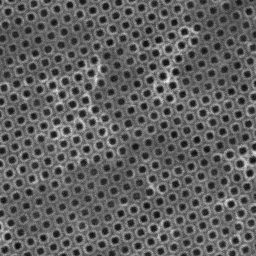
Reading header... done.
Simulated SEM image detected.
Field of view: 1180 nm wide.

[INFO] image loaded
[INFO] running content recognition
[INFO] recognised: a regular array of holes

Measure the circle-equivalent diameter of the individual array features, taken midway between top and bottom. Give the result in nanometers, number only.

37.5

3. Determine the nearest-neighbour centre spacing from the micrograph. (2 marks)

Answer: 0.0615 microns